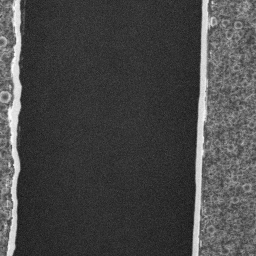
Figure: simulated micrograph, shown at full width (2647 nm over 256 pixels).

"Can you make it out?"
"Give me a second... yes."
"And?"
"one or a few lines or trenches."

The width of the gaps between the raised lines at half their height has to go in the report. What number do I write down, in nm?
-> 1920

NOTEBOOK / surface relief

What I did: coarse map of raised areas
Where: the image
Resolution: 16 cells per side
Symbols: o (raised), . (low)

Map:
o............ooo
o............ooo
o............ooo
o............ooo
o............ooo
o............ooo
o............ooo
o............ooo
o............ooo
o...........oooo
o...........oooo
o...........oooo
o...........oooo
o...........oooo
o...........oooo
o...........oooo